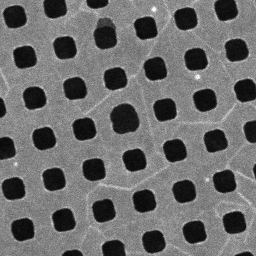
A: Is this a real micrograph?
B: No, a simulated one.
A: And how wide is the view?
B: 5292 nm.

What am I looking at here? a regular array of holes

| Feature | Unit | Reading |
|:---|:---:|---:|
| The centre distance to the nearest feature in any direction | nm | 853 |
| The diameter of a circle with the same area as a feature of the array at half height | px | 24.2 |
